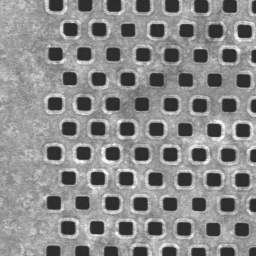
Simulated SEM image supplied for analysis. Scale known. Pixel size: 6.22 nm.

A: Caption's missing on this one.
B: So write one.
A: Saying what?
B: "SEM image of a regular array of holes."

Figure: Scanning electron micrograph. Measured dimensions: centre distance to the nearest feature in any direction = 177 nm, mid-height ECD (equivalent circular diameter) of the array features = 93.4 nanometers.